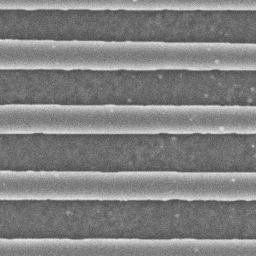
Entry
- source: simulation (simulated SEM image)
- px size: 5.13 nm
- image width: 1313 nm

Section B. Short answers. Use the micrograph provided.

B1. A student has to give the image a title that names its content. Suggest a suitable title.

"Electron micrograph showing lines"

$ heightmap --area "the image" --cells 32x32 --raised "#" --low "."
################################
................................
................................
................................
................................
#############################...
################################
################################
################################
................................
................................
................................
................................
################################
################################
################################
################################
................................
................................
................................
................................
##.#.#..........................
################################
################################
################################
................................
................................
................................
................................
................................
################################
################################